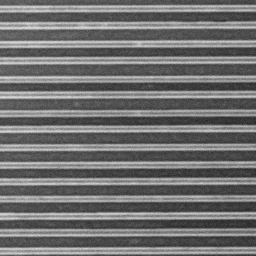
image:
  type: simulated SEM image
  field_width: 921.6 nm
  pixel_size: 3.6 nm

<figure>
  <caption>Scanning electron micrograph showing parallel lines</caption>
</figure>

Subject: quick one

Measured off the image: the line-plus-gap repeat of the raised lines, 62.3 nm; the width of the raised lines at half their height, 0.0207 um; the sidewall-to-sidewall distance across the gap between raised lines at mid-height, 41.9 nm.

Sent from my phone